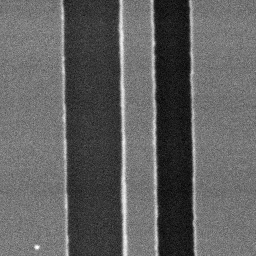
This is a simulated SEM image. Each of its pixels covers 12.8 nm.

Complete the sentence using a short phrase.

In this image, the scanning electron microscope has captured lines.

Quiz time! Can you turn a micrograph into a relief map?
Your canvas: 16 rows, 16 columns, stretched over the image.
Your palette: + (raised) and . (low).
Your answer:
++++....++..++++
++++....++..++++
++++....++..++++
++++....++..++++
++++....++..++++
++++....++..++++
++++....++..++++
++++....++..++++
++++....++..++++
++++....++..++++
++++....++..++++
++++....++..++++
++++....++..++++
++++....++..++++
++++....++..++++
++++....++..++++